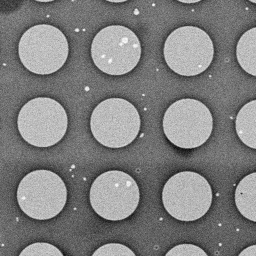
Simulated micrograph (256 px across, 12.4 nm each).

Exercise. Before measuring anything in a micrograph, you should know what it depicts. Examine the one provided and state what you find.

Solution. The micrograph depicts an array of small figures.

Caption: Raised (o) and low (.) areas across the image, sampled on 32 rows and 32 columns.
................................
................................
................................
....ooo......ooo.......oo.......
...ooooo....ooooo....ooooo....oo
..oooooo....ooooo....oooooo...oo
..oooooo...ooooooo...oooooo...oo
...ooooo....ooooo....ooooo....oo
...oooo.....ooooo....ooooo....oo
................................
................................
................................
....ooo......oo........o........
...ooooo....ooooo....ooooo....oo
..oooooo...oooooo....ooooo....oo
..oooooo...oooooo...oooooo....oo
..oooooo....ooooo....ooooo....oo
...oooo.....ooooo....ooooo....oo
................................
................................
................................
....oo.......oo.................
...ooooo....ooooo....ooooo....oo
..oooooo...oooooo...oooooo....oo
..oooooo...oooooo...oooooo...ooo
..oooooo...oooooo...oooooo....oo
...oooo.....ooooo....ooooo....oo
.......................o.......o
................................
................................
....oo..........................
...ooooo....ooooo....oooo.....oo